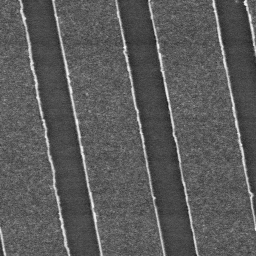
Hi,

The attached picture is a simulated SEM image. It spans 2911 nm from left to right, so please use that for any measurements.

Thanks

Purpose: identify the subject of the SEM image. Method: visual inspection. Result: one or a few lines or trenches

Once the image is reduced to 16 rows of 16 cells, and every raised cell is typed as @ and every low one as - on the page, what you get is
@--@@@@--@@@@--@
@@--@@@@--@@@@--
@@--@@@@--@@@@--
@@--@@@@--@@@@--
@@--@@@@--@@@@--
@@--@@@@--@@@@--
@@---@@@---@@@@-
@@@--@@@@--@@@@-
@@@--@@@@--@@@@-
@@@--@@@@--@@@@-
@@@--@@@@--@@@@-
@@@--@@@@--@@@@-
@@@@--@@@@--@@@@
@@@@--@@@@--@@@@
@@@@--@@@@--@@@@
@@@@--@@@@--@@@@